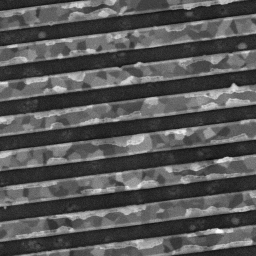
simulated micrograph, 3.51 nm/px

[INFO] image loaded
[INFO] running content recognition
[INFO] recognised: parallel lines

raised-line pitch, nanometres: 122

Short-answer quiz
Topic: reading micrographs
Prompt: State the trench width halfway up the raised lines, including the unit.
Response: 58 nm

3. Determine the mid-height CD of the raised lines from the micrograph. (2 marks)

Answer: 64.1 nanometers